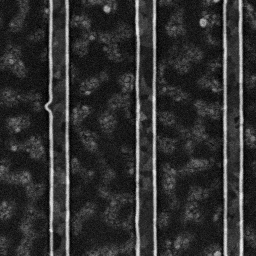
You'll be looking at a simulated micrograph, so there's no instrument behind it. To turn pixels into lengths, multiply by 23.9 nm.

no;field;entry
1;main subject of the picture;one or a few lines or trenches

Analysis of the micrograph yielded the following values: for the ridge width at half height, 373 nm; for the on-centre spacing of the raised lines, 2080 nm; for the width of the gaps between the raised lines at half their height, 1.7 µm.